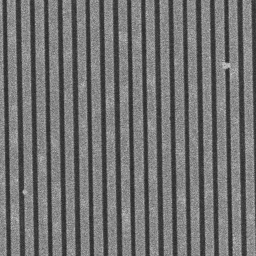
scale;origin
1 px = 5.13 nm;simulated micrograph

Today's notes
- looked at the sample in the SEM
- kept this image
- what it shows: parallel lines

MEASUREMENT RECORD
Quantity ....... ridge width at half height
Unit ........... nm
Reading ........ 45.5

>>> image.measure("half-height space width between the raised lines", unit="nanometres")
23.1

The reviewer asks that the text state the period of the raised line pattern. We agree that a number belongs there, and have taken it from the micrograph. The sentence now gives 71.1 nm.